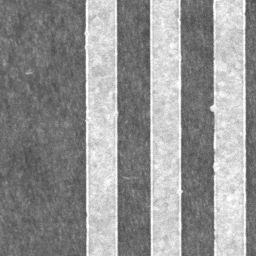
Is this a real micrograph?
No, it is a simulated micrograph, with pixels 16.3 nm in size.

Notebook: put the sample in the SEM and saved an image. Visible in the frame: one or a few lines or trenches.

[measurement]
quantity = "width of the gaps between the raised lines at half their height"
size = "574 nanometers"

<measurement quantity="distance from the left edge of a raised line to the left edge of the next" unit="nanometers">1040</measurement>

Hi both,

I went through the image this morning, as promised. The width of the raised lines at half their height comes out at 474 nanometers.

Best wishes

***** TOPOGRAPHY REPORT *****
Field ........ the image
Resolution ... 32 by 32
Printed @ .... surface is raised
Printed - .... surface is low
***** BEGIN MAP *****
-----------@@@-----@@@-----@@@--
-----------@@@-----@@@-----@@@--
-----------@@@-----@@@-----@@@--
-----------@@@-----@@@-----@@@--
-----------@@@-----@@@-----@@@--
-----------@@@-----@@@-----@@@--
-----------@@@-----@@@-----@@@--
-----------@@@-----@@@-----@@@--
-----------@@@-----@@@-----@@@--
-----------@@@-----@@@-----@@@--
-----------@@@-----@@@-----@@@--
-----------@@@-----@@@-----@@@--
-----------@@@-----@@@-----@@@--
-----------@@@-----@@@-----@@@--
-----------@@@@----@@@-----@@@--
-----------@@@-----@@@-----@@@--
-----------@@@-----@@@-----@@@--
-----------@@@-----@@@-----@@@--
-----------@@@-----@@@-----@@@--
-----------@@@-----@@@-----@@@--
-----------@@@-----@@@-----@@@--
-----------@@@-----@@@-----@@@--
-----------@@@-----@@@-----@@@--
-----------@@@-----@@@@----@@@--
-----------@@@-----@@@@----@@@--
-----------@@@-----@@@-----@@@--
-----------@@@-----@@@-----@@@--
-----------@@@-----@@@-----@@@--
-----------@@@-----@@@-----@@@--
-----------@@@-----@@@-----@@@--
-----------@@@@----@@@-----@@@@-
-----------@@@@----@@@-----@@@@-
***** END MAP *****